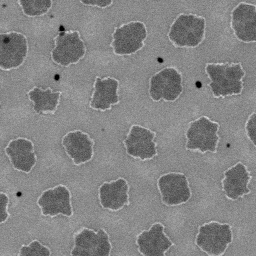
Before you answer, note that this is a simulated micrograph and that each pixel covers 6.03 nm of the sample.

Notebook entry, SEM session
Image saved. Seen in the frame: a regular array of raised bodies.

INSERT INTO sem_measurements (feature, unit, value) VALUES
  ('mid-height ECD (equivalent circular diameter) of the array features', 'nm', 199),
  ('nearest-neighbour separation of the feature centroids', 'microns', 0.346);